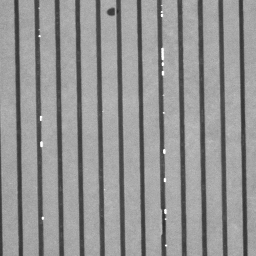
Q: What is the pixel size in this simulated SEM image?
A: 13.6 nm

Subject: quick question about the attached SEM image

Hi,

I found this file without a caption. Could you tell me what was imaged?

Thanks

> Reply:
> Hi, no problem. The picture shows parallel lines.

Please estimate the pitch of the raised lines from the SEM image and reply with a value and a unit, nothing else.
278 nanometres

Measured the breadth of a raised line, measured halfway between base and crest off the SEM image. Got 211 nanometers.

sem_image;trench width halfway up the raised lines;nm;66.3